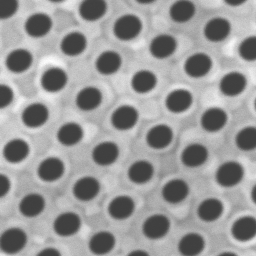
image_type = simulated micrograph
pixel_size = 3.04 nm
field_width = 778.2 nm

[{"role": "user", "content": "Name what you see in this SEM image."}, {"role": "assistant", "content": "a regular array of holes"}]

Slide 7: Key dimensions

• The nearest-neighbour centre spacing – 120 nanometres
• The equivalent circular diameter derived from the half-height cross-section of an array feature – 74.5 nm